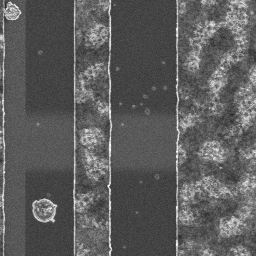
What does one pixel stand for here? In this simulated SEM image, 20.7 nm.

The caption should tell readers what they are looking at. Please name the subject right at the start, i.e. one or a few lines or trenches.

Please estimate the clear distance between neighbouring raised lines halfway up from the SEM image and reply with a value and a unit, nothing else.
1400 nanometers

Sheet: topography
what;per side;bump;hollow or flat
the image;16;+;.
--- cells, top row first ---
+....++....+++++
.....++....+++++
.....++....+++++
.....++....+++++
.....++....+++++
.....++....+++++
.....++....+++++
.....++....+++++
.....++....+++++
.....++....+++++
.....++....+++++
.....++....+++++
.....++....+++++
.....++....+++++
.....++....+++++
.....++....+++++